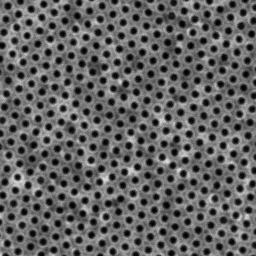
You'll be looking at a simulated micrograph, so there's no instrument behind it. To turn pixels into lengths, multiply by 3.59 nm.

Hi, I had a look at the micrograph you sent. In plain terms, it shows a regular array of holes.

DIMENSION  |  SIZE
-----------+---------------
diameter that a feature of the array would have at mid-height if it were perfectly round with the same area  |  8.61 px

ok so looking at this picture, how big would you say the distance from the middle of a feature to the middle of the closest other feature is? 0.0476 µm